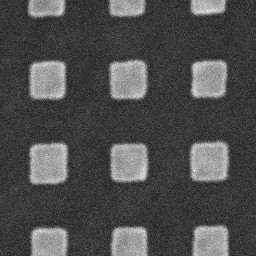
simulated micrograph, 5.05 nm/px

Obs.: raised bodies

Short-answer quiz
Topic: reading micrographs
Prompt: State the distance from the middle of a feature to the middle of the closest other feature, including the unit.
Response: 0.407 um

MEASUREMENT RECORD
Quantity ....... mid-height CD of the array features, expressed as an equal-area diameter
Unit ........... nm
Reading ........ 198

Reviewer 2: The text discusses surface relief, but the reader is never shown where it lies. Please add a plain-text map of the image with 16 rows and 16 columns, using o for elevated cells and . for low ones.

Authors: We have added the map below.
..oo...oo...oo..
................
................
................
..oo...oo...oo..
..oo...oo...oo..
................
................
................
..oo...oo...oo..
..oo...oo...oo..
................
................
................
..oo...oo...oo..
..oo...oo...oo..